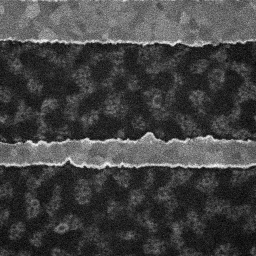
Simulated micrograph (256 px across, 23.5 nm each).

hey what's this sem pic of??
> one or a few lines or trenches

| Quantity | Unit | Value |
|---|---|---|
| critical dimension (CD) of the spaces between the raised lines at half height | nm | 2300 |